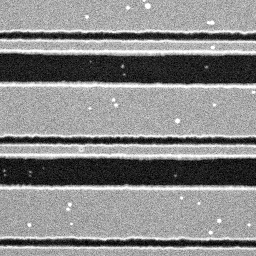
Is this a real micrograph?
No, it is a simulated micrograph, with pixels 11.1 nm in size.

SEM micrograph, lines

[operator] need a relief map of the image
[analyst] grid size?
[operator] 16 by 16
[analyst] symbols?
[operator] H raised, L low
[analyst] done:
HHHHHHHHHHHHHHHH
HHHHHHHHHHHHHHHH
HHHHHHHHHHHHHHHH
LLLLLLLLLLLLLLLL
LLLLLLLLLLLLLLLL
HHHHHHHHHHHHHHHH
HHHHHHHHHHHHHHHH
HHHHHHHHHHHHHHHH
HHHHHHHHHHHHHHHH
HHHHHHHHHHHHHHHH
LLLLLLLLLLLLLLLL
LLLLLLLLLLLLLLLL
HHHHHHHHHHHHHHHH
HHHHHHHHHHHHHHHH
HHHHHHHHHHHHHHHH
HHHHHHHHHHHHHHHH